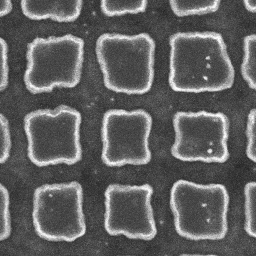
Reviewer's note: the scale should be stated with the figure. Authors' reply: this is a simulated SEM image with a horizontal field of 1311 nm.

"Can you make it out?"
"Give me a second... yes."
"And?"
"a regular array of raised bodies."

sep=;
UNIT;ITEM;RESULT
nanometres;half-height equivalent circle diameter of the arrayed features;282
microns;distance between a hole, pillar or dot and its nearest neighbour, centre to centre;0.371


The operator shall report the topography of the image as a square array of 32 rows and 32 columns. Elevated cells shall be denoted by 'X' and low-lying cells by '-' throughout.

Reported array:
X--XXXXXXX---XXXXX----XXXXX----X
X--XXXXXXX---XXX------XXX-------
--------------------------------
--------------------------------
----------------------XXXXX-----
X---XXXXXX--XXXXXXX--XXXXXXX---X
X---XXXXXX--XXXXXXX--XXXXXXX---X
X---XXXXXX---XXXXXX--XXXXXXXX--X
X---XXXXXX---XXXXXX--XXXXXXXX-XX
X--XXXXXXX---XXXXXX--XXXXXXXX--X
----XXXXX----XXXXXX--XXXXXXXX--X
----------------X---------------
--------------------------------
--------------------------------
----XXXXXX---XXXXX----XXXXXX---X
X--XXXXXXX---XXXXXX---XXXXXX---X
X--XXXXXXX---XXXXXX---XXXXXX---X
X---XXXXXX---XXXXX----XXXXXX---X
X---XXXXXX---XXXXX----XXXXXX---X
X---XXXXXX---XXXXX----XXXXXX---X
-----X--------X-----------------
--------------------------------
--------------------------------
------XXXX----XXXXX---XXXXXX---X
X----XXXXX---XXXXXX---XXXXXX---X
X----XXXXX---XXXXXX---XXXXXX---X
X---XXXXXX---XXXXXX---XXXXXX---X
X---XXXXXX---XXXXXX---XXXXXX---X
X----XXXXX---XXXXXX---XXXXXX---X
-----XXXXX------X-X----XXXXX----
--------------------------------
--------------------------------